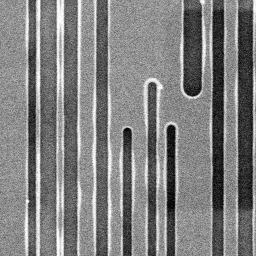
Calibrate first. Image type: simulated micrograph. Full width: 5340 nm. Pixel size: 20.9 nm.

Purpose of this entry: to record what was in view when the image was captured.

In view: groups of lines, slits or small figures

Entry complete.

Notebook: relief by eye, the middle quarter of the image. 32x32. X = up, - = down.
----XXXX---XXXXXXXXXXXXXXXXXX---
----XXXX---XXXXXXXXXXXXXXXXXX---
----XXXX---XXXXXXXXXXXXXXXXXX---
----XXXX---XXXXXXXXXXXXXXXXXX---
----XXXX---XXXXXXXXXX--XXXXXX---
----XXXX---XXXXXXXXX---XXXXXX---
----XXXX---XXXXXXXXX----XXXXXX--
----XXXX---XXXXXXXXX----XXXXXX--
----XXXX---XXXXXXXXX---XXXXXXXXX
----XXXX---XXXXXXXXX---XXXXXXXXX
----XXXX---XXXXXXXXX---XXXXXXXXX
----XXXX---XXXXXXXXX---XXXXXXXXX
----XXXX---XXXXXXXXX---XXXXXXXXX
----XXXX---XXXXXXXXXX--XXXXXXXXX
----XXXX---XXXXXXXXXX--XXXXXXXXX
----XXXX---XXXXXXXXXX--XXX--XXXX
----XXXX---XXXX--XXXX--XX---XXXX
----XXXX---XXXX--XXXX--XX---XXXX
----XXXX---XXXX--XXXX--XX---XXXX
----XXXX---XXXX--XXXX--XX---XXXX
----XXXX---XXXX--XXXX--XX---XXXX
----XXXX---XXX---XXXX--XX---XXXX
----XXXX---XXX---XXXX--XX---XXXX
----XXXX---XXX---XXXX--XX---XXXX
---XXXXX---XXX---XXXX--XX---XXXX
---XXXXX---XXX---XXXX--XX---XXXX
----XXXX---XXX---XXXX--XX---XXXX
---XXXXX---XXX---XXX---XX---XXXX
---XXXXX---XXX---XXXX--XX---XXXX
----XXXX---XXX---XXXX--XX---XXXX
----XXXX---XXX---XXXX--XX---XXXX
----XXXX---XXX---XXXX--XX---XXXX